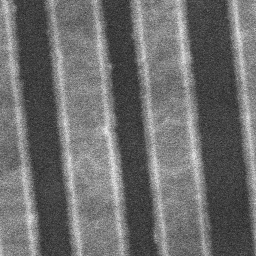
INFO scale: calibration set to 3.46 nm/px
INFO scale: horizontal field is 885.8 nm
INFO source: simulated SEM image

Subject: one or a few lines or trenches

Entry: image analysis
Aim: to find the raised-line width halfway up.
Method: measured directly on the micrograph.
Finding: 141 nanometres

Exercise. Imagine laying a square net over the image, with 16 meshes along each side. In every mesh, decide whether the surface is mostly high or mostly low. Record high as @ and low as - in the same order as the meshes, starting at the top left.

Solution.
---@@@---@@----@
@--@@@---@@----@
@---@@---@@----@
@---@@---@@----@
@---@@---@@@---@
@---@@---@@@---@
@---@@@--@@@---@
@---@@@--@@@---@
@---@@@---@@----
@---@@@---@@----
@@--@@@---@@----
@@--@@@---@@----
@@---@@---@@----
@@---@@---@@@---
@@---@@@--@@@---
@@---@@@--@@@---